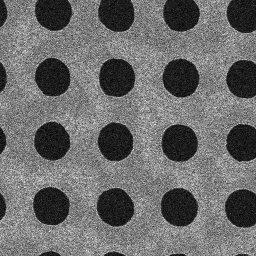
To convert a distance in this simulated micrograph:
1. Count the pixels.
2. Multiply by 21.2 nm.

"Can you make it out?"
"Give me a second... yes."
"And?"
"a regular array of holes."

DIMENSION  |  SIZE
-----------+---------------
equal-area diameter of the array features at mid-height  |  797 nm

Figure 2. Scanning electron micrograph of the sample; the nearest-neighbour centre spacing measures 1360 nanometers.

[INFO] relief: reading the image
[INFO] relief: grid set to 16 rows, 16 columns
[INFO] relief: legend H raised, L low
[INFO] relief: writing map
HHLLHHLLHHLLHHLL
HHHLHHHLHHLLHHLL
HHHHHHHHHHHHHHHH
HHHHHHHHHHHHHHHH
HHLLHHLLHHLLHHLL
HHLLHHLLHHLLHHLL
HHHHHHHHHHHHHHHH
HHHHHHHHHHHHHHHH
HHLLHHLLHHLLHHLL
HHLLHHLLHHLLHHLL
HHHHHHHHHHHHHHHH
HHHHHHHHHHHHHHHH
HHLLHHLLHHLLHHLL
HHLLHHLLHHLLHHLL
HHHHHHHHHHHHHHHH
HHHHHHHHHHHHHHHH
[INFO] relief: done